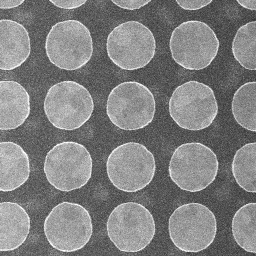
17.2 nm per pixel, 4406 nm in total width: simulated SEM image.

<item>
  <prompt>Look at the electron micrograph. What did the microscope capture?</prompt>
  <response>a regular array of raised bodies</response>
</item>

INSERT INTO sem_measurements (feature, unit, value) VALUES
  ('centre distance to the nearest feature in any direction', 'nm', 1040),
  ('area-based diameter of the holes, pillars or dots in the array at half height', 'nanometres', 828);